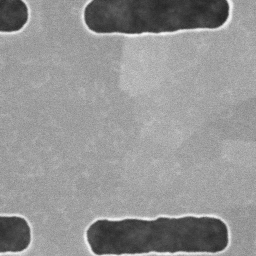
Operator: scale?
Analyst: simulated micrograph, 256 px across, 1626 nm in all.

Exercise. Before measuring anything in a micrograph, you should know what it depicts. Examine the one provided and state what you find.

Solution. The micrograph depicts holes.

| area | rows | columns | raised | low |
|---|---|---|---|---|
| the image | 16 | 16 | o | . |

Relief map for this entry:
..ooo.........oo
..ooo.........oo
oooooooooooooooo
oooooooooooooooo
oooooooooooooooo
oooooooooooooooo
oooooooooooooooo
oooooooooooooooo
oooooooooooooooo
oooooooooooooooo
oooooooooooooooo
oooooooooooooooo
oooooooooooooooo
oooooooooooo.ooo
..ooo.........oo
..oooo........oo